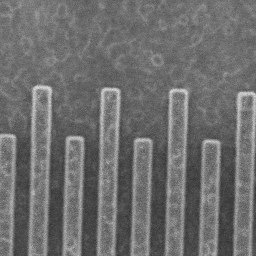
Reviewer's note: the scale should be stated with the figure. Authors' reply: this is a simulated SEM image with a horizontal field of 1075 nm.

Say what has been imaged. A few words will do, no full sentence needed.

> parallel lines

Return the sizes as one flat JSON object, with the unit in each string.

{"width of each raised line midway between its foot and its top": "71.3 nm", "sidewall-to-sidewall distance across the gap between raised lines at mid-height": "17 pixels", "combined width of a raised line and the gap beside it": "0.143 um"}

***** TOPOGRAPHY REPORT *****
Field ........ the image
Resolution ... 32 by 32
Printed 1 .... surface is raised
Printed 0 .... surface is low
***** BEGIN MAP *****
00000000000000000000000000000000
00000000000000000000000000000000
00000000000000000000000000000000
00000000000000000000000000000000
00000000000000000000000000000000
00000000000000000000000000000000
00000000000000000000000000000000
00000000000000000000000000000000
00000000000000000000000000000000
00000000000000000000000000000000
00000000000000000000000000000000
00001100000001100000011000000000
00001100000001100000011000000011
00001100000001100000011000000011
00001100000001100000011000000011
00001100000001100000011000000011
00001100000001100000011000000011
11001100110001100110011000000011
11001100110001100110011001100011
11001100110001100110011001100011
11001100110001100110011001100011
11001100110011100110011001100011
11001100110011100110011001100011
11001100110011100110011001100111
11001100110011100110011001100111
11001100110011000110011001100111
11001100110011000110011001100111
11001100110011000110011001100110
11001100110011000110011001100110
11001100110011001110011001100110
11001100110011000110011001100110
10001100110011001110011001100110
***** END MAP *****